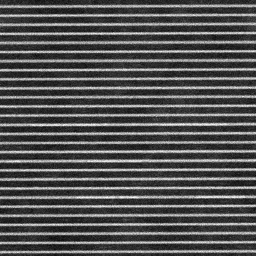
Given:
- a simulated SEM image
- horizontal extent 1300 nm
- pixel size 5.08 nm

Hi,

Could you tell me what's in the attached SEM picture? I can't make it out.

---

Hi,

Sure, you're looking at parallel lines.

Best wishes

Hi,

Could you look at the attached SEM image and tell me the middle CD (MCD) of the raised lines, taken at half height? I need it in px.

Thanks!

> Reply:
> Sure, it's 1.87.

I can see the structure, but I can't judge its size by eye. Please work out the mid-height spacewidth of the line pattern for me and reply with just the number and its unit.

0.0343 um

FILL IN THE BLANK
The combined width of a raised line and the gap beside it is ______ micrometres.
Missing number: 0.0462